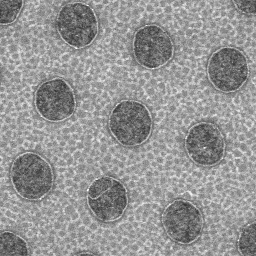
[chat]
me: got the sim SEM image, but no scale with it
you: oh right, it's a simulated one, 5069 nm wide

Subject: a regular array of raised bodies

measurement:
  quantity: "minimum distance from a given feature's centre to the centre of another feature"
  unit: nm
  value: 1540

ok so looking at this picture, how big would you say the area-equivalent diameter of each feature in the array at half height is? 826 nm